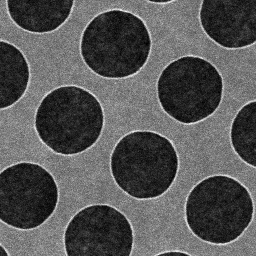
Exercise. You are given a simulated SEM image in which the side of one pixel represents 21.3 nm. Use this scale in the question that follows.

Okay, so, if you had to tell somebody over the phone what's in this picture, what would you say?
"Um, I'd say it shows holes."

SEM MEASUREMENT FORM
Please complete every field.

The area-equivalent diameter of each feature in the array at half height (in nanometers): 1440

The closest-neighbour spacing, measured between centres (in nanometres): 1850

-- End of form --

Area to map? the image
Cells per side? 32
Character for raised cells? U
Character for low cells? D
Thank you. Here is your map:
UDDDDDDDDUUUUUUUUUUUUUUUUDDDDDDD
UDDDDDDDDUUUUDDDUUUUUUUUUDDDDDDD
UUDDDDDDUUUUDDDDDDUUUUUUUDDDDDDD
UUUDDDDUUUUDDDDDDDUUUUUUUDDDDDDD
UUUUUUUUUUDDDDDDDDDUUUUUUUDDDDDD
DUUUUUUUUUDDDDDDDDDUUUUUUUUDDDDU
DDDUUUUUUUDDDDDDDDDUUUUUUUUUUUUU
DDDUUUUUUUDDDDDDDDUUUUDDDDUUUUUU
DDDDUUUUUUUDDDDDDDUUUDDDDDDUUUUU
DDDDUUUUUUUUUDDDUUUUDDDDDDDDUUUU
DDDUUUUUUUUUUUUUUUUUDDDDDDDDUUUU
DDDUUUDDDDDUUUUUUUUUDDDDDDDDUUUU
DDUUUDDDDDDDUUUUUUUUDDDDDDDDUUUU
UUUUUDDDDDDDDUUUUUUUDDDDDDDUUUDD
UUUUDDDDDDDDDUUUUUUUUDDDDDUUUUDD
UUUUDDDDDDDDDUUUUUUUUUUUUUUUUDDD
UUUUUDDDDDDDDUUUUDDUUUUUUUUUUDDD
UUUUUDDDDDDDUUUDDDDDDUUUUUUUUDDD
UUUUUUDDDDDUUUDDDDDDDDUUUUUUUDDD
UUUUUUUUUUUUUUDDDDDDDDUUUUUUUUDD
UUDDUUUUUUUUUUDDDDDDDDUUUUUUUUUD
DDDDDDUUUUUUUUDDDDDDDDUUUUUUUUUU
DDDDDDDUUUUUUUDDDDDDDDUUUUDDDUUU
DDDDDDDUUUUUUUUDDDDDDUUUDDDDDDDU
DDDDDDDUUUUUUUUUDDDDUUUUDDDDDDDU
DDDDDDDUUUUUUUUUUUUUUUUDDDDDDDDD
DDDDDDDUUUDDDDDUUUUUUUUDDDDDDDDD
DDDDDDUUUDDDDDDDUUUUUUUDDDDDDDDU
UUDDUUUUDDDDDDDDUUUUUUUUDDDDDDDU
UUUUUUUUDDDDDDDDDUUUUUUUUDDDDDUU
UUUUUUUUDDDDDDDDDUUUUUUUUUUUUUUU
DUUUUUUUDDDDDDDDUUUUUDUUUUUUUUUU